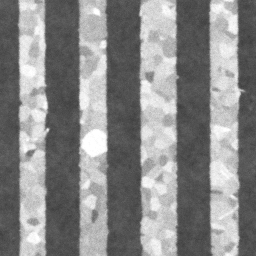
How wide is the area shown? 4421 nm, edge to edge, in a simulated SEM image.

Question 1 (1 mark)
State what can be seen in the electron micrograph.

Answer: one or a few lines or trenches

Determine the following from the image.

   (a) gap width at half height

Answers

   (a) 0.6 micrometres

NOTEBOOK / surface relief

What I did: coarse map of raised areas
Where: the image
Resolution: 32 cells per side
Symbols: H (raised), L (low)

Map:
LLHHHHLLLLHHHLLLLLHHHHLLLLHHHHLL
LLHHHHLLLLHHHLLLLLHHHHLLLLHHHHLL
LLLHHLLLLLHHHLLLLLHHHHLLLLHHHHLL
LLHHHHLLLLHHHLLLLLHHHHLLLLHHHHLL
LLHHHHLLLLHHHLLLLLHHHHLLLLHHHHLL
LLLHHHLLLLHHHLLLLLHHHHLLLLHHHHLL
LLLHHHLLLLHHHLLLLLHHHHLLLLHHHHLL
LLLHHHLLLLHHHLLLLLHHHHLLLLHHHHLL
LLLHHHLLLLHHHLLLLLHHHHLLLLHHHHLL
LLLHHHLLLLHHHLLLLLHHHHLLLLHHHHLL
LLLHHHLLLLHHHLLLLLHHHHLLLLHHHHLL
LLLHHHLLLLHHHLLLLLHHHHLLLLHHHHLL
LLLHHHLLLLHHHLLLLLHHHHLLLLHHHHLL
LLLHHHLLLLHHHLLLLLHHHHLLLLHHHHLL
LLHHHHLLLLHHHLLLLLHHHHLLLLHHHHLL
LLLHHHLLLLHHHLLLLLHHHHLLLLHHHHLL
LLLHHHLLLLHHHLLLLLHHHHLLLLHHHHLL
LLHHHHLLLLHHHLLLLLHHHHLLLLHHHHLL
LLLHHHLLLLHHHLLLLLHHHHLLLLHHHHLL
LLLHHHLLLLHHHLLLLLHHHHLLLLHHHHLL
LLLHHHLLLLHHHLLLLLHHHHLLLLHHHHLL
LLLHHHLLLLHHHLLLLLHHHHLLLLHHHHLL
LLLHHHLLLLHHHLLLLLHHHHLLLLHHHHLL
LLLHHHLLLLHHHLLLLLHHHHLLLLHHHHLL
LLLHHHLLLLHHHLLLLLHHHHLLLLHHHHLL
LLLHHHLLLLHHHLLLLLHHHHLLLLHHHHLL
LLLHHHLLLLHHHLLLLLHHHHLLLLHHHHLL
LLLHHHLLLLHHHLLLLLHHHHLLLLHHHHLL
LLLHHHLLLLHHHLLLLLHHHHLLLLHHHHLL
LLLHHHLLLLHHHLLLLLHHHHLLLLHHHHLL
LLLHHHLLLLHHHLLLLLHHHHLLLLHHHHLL
LLLHHHLLLLHHHLLLLLHHHHLLLLLHHHLL